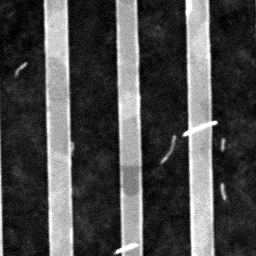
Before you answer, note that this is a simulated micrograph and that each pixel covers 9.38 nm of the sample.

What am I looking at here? one or a few lines or trenches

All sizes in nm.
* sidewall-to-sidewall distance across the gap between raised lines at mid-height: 468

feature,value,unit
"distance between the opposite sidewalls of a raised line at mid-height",202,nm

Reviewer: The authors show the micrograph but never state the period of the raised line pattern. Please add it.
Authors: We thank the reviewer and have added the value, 0.663 micrometres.